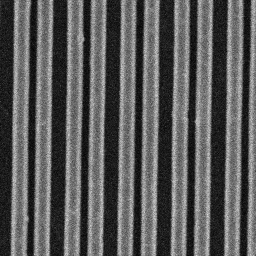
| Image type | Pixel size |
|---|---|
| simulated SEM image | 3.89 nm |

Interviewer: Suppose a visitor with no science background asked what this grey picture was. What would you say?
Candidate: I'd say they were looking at parallel lines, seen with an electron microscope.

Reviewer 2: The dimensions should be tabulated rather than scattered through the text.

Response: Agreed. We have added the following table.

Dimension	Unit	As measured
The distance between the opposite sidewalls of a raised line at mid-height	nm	48.2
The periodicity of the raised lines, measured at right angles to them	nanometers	104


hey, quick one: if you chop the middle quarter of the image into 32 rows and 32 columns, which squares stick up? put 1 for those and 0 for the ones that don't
01110001110000011000111000001110
01110001110000111000111000001110
01110001110000111000111000001110
01110001110000111100111000001110
01110001110000111100111000001110
01110001110000111000111000001110
01110001110000111000111000001110
01110001110000111000111000001110
01110001110000111000111000001110
01110001110000111000111000001110
01110001110000111000111000001110
01110001110000111000111000001110
01110001110000111000111000001100
01110001110000111000111000001110
01110001110000111000111000001110
01110001110000111000111000011110
01110001110000111000111000011110
01110001110000111000111000011110
01110001110000111000111000011110
01110001110000111000111000011100
01110001110000111000111000011100
01110001110000111000111000011100
01110001110000111000111000011100
01110001110000111000111000011100
01110001110000111000111000011100
01110001110000111000111000011100
01110001110000111000111000001100
01110001100000111000111000001100
01110001100000111000111000001100
01110001100000111000111000001100
01110001100000111000111000001100
01110001100000111000111000011100